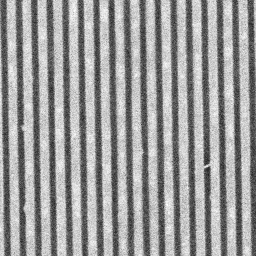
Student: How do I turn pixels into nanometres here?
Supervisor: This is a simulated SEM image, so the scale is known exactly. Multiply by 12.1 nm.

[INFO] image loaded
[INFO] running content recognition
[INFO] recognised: parallel lines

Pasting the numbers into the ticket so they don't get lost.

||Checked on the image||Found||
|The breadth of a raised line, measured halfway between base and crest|0.106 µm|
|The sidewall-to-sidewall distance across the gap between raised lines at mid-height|0.0816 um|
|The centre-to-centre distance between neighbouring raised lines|187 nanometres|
